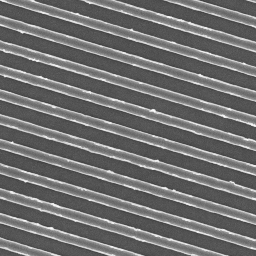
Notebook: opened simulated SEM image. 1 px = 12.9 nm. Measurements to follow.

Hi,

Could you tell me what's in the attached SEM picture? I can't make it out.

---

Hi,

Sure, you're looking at parallel lines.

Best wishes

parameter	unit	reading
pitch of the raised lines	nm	306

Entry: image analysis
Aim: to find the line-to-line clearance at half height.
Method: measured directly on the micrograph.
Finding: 188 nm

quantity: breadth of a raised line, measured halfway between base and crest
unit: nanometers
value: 122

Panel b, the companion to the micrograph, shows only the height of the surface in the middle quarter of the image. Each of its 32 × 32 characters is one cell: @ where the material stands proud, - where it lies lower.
@@@@@@------------@@@@@@@@------
-@@@@@@@@-------------@@@@@@@@--
----@@@@@@@@-------------@@@@@@@
--------@@@@@@@@------------@@@@
-----------@@@@@@@@------------@
@-------------@@@@@@@@----------
@@@@@-------------@@@@@@@@------
@@@@@@@@-------------@@@@@@@@---
---@@@@@@@@-------------@@@@@@@@
-------@@@@@@@@-------------@@@@
----------@@@@@@@@@------------@
@-------------@@@@@@@@@---------
@@@@@------------@@@@@@@@-------
@@@@@@@@------------@@@@@@@@----
---@@@@@@@@------------@@@@@@@@@
-------@@@@@@@@------------@@@@@
----------@@@@@@@@------------@@
-------------@@@@@@@@-----------
@@@@-------------@@@@@@@@-------
@@@@@@@-------------@@@@@@@@----
--@@@@@@@@@------------@@@@@@@@@
------@@@@@@@@-------------@@@@@
---------@@@@@@@@-------------@@
------------@@@@@@@@@-----------
@@@-------------@@@@@@@@--------
@@@@@@-------------@@@@@@@@-----
--@@@@@@@@-------------@@@@@@@@-
-----@@@@@@@@-------------@@@@@@
---------@@@@@@@-------------@@@
------------@@@@@@@@------------
@@@------------@@@@@@@@---------
@@@@@@------------@@@@@@@@@@----